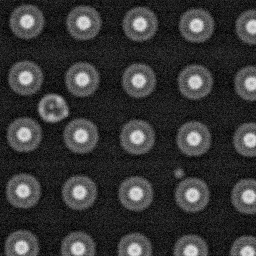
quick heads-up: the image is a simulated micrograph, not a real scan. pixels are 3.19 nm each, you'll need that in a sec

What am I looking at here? an array of small figures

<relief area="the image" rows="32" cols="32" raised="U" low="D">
DDDDDDDDDDDDDDDDDDDDDDDDDDDDDDDD
DDUUUDDDDUUUDDDDUUUDDDDUUUDDDDDU
DUUUUDDDUUUUUDDUUUUUDDDUUUUDDDUU
DUUUUDDDUUUUDDDUUUUUDDUUUUUDDDUU
DDUUDDDDDUUUDDDDUUUDDDDUUUDDDDUU
DDDDDDDDDDDDDDDDDDDDDDDDDDDDDDDD
DDDDDDDDDDDDDDDDDDDDDDDDDDDDDDDD
DDDDDDDDDDDDDDDDDDDDDDDDDDDDDDDD
DUUUUDDDDUUUDDDDUUUDDDDUUUDDDDDU
DUUUUDDDUUUUDDDUUUUDDDUUUUDDDDUU
DUUUUDDDUUUUDDDUUUUDDDUUUUUDDUUU
DDUUDDDDDUUUDDDDUUUDDDDUUUDDDDUU
DDDDDUUUDDDDDDDDDDDDDDDDDDDDDDDU
DDDDDUUUDDDDDDDDDDDDDDDDDDDDDDDD
DDDDDUUUDDDDDDDDDDDDDDDDDDDDDDDD
DUUUUDDDDUUUDDDDUUDDDDDUUDDDDDDU
DUUUUDDDUUUUDDDUUUUDDDUUUUDDDUUU
DUUUUDDDUUUUDDDUUUUDDDUUUUDDDUUU
DDUUDDDDDUUUDDDDUUUDDDUUUUDDDUUU
DDDDDDDDDDDDDDDDDDDDDDDDDDDDDDDU
DDDDDDDDDDDDDDDDDDDDDDDDDDDDDDDD
DDDDDDDDDDDDDDDDDDDDDDUDDDDDDDDD
DUUUDDDDDUUDDDDDUUDDDDDUUDDDDDUU
DUUUUDDDUUUUDDDUUUUDDDUUUUDDDUUU
DUUUUDDDUUUUDDDUUUUDDDUUUUDDDUUU
DDUUDDDDUUUUDDDUUUUDDDUUUUDDDUUU
DDDDDDDDDDDDDDDDDDDDDDDDDDDDDDUU
DDDDDDDDDDDDDDDDDDDDDDDDDDDDDDDD
DDDDDDDDDDDDDDDDDDDDDDDDDDDDDDDD
DUUUDDDDUUUDDDDDUUDDDDDUUDDDDDDD
DUUUUDDDUUUUDDDUUUUDDDUUUUDDDUUU
DUUUUDDDUUUUDDDUUUUDDDUUUUDDDUUU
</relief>